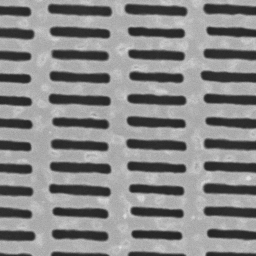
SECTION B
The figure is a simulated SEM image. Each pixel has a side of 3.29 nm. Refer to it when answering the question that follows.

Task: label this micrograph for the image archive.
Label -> a regular array of holes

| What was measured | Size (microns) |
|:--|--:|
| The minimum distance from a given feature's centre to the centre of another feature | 0.0736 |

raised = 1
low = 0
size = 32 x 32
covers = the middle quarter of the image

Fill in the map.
11111111111111111111111111111111
11111111111111111111111111111111
00000000000111110000000000000111
00000000000111111000000000000011
00000000000111111111110001000111
11111111111111111111111111111111
11111111111111111111111111111111
11111111111111111000001111111111
00000000000111110000000000000011
00000000000011110000000000000001
11111110000111111111111111111111
11111111111111111111111111111111
11111111111111111111111111111111
01010101111111110000000001111111
00000000000111110000000000000011
00000000000111111000000000000011
11111111111111111111111111111111
11111111111111111111111111111111
11111111111111111111111111111111
00000000011111110000000000000011
00000000000111110000000000000001
11110000000111111111110001000011
11111111111111111111111111111111
11111111111111111111111111111111
11111111111111110001111111111111
00000000000011110000000000000011
00000000000011110000000000000011
11111111110111111111111111111111
11111111111111111111111111111111
11111111111111111111111111111111
00000000111111110000000000000111
00000000000011110000000000000011